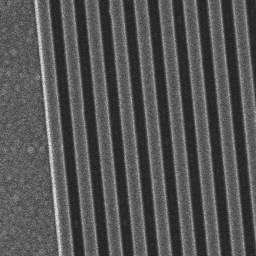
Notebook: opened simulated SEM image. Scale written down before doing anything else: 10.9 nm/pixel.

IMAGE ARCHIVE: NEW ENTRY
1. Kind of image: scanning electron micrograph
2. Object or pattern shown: parallel lines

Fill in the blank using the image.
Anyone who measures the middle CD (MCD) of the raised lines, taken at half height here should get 161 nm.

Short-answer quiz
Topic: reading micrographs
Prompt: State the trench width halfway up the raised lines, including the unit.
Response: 0.104 um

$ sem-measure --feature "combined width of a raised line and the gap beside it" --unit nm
267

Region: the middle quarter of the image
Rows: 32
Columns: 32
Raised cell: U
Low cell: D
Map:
DUUUDDDUUUDDDUUUDDDUUUDDDUUUUDDU
DUUUDDDUUUDDDUUUUDDUUUUDDUUUUDDU
DUUUDDDUUUDDDUUUUDDUUUUDDUUUUDDD
DUUUDDDUUUDDDUUUUDDUUUUDDUUUUDDD
DUUUDDDUUUUDDUUUUDDUUUUDDUUUUDDD
DUUUUDDUUUUDDUUUUDDUUUUDDDUUUDDD
DUUUUDDUUUUDDUUUUDDDUUUDDDUUUDDD
DUUUUDDUUUUDDDUUUDDDUUUDDDUUUDDD
DUUUUDDUUUUDDDUUUDDDUUUDDDUUUDDD
DUUUUDDDUUUDDDUUUDDDUUUDDDUUUDDD
DDUUUDDDUUUDDDUUUDDDUUUDDDUUUUDD
DDUUUDDDUUUDDDUUUDDDUUUUDDUUUUDD
DDUUUDDDUUUDDDUUUUDDUUUUDDUUUUDD
DDUUUDDDUUUDDDUUUUDDUUUUDDUUUUDD
DDUUUDDDUUUDDDUUUUDDUUUUDDUUUUDD
DDUUUUDDUUUUDDUUUUDDUUUUDDUUUUDD
DDUUUUDDUUUUDDUUUUDDDUUUDDDUUUDD
DDUUUUDDUUUUDDDUUUDDDUUUDDDUUUDD
DDUUUUDDUUUUDDDUUUDDDUUUDDDUUUDD
DDUUUUDDUUUUDDDUUUDDDUUUDDDUUUDD
DDDUUUDDDUUUDDDUUUDDDUUUDDDUUUDD
DDDUUUDDDUUUDDDUUUDDDUUUUDDUUUUD
DDDUUUDDDUUUDDDUUUUDDUUUUDDUUUUD
DDDUUUDDDUUUDDDUUUUDDUUUUDDUUUUD
DDDUUUDDDUUUDDDUUUUDDUUUUDDUUUUD
DDDUUUDDDUUUUDDUUUUDDUUUUDDUUUUD
UDDUUUUDDUUUUDDUUUUDDUUUUDDDUUUD
UDDUUUUDDUUUUDDDUUUDDDUUUDDDUUUD
UDDUUUUDDUUUUDDDUUUDDDUUUDDDUUUD
UDDUUUUDDUUUUDDDUUUDDDUUUDDDUUUD
UDDUUUUDDDUUUDDDUUUDDDUUUDDDUUUD
UDDDUUUDDDUUUDDDUUUDDDUUUDDDUUUU